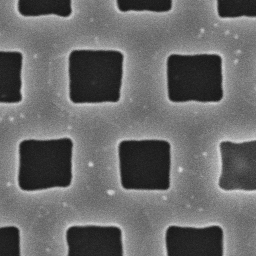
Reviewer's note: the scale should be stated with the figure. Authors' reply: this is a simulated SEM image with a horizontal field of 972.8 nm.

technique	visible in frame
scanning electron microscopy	holes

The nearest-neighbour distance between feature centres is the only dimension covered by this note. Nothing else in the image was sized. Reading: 378 nm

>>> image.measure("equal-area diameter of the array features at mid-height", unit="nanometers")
219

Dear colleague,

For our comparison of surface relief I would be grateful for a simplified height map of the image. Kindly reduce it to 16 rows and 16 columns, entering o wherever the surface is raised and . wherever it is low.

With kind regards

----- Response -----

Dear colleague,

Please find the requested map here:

o...oooo...ooo..
oooooooooooooooo
oooooooooooooooo
.ooo....ooo..ooo
.ooo....oo....oo
.ooo....oo....oo
oooooooooooooooo
oooooooooooooooo
oooooooooooooooo
o....oo....ooooo
o....oo....ooooo
o...oooo...ooooo
oooooooooooooooo
oooooooooooooooo
.ooo....oo....oo
.ooo....oo....oo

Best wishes